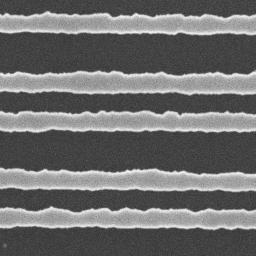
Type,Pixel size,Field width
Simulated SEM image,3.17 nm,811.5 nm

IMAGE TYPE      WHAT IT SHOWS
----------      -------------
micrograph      lines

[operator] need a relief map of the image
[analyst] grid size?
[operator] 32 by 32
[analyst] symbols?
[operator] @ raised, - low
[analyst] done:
--------------------------------
--------------------------------
@@@@@@@@@@@@@@@@@@@@@@@@@@@@@@@@
@@@@@@@@@@@@@@@@@@@@@@@@@@@@@@@@
--------------------------------
--------------------------------
--------------------------------
--------------------------------
--------------------------------
@@@@@@@@@@@@@@@@@@@@@@@@@@@@@@@@
@@@@@@@@@@@@@@@@@@@@@@@@@@@@@@@@
-@-@@----@@@@@@@@@@@@@@@@@@@@@@@
--------------------------------
--------------------------------
@@@@@@@@@@@@@@@@@@@@@@@@@@@@@@@@
@@@@@@@@@@@@@@@@@@@@@@@@@@@@@@@@
----@----------------------@----
--------------------------------
--------------------------------
--------------------------------
--------------------------------
@@@@@@@@@--@@--@@@@@@@@---------
@@@@@@@@@@@@@@@@@@@@@@@@@@@@@@@@
@-@@@@@@@@@@@@@@@@@@@@@@@@@@@@@@
--------------------------------
--------------------------------
@@@@@@@@@-@@@@@@@@@@@@@@@@@@@@@@
@@@@@@@@@@@@@@@@@@@@@@@@@@@@@@@@
-----------------------@-@@@@@@@
--------------------------------
--------------------------------
--------------------------------